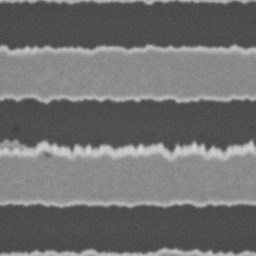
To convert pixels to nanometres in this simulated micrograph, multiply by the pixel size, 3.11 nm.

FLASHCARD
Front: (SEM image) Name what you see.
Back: lines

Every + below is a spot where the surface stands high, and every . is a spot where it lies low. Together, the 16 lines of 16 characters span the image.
................
................
................
++++++++++++++++
++++++++++++++++
++++++++++++++++
................
................
................
++++++++++.++.++
++++++++++++++++
++++++++++++++++
++++++++++++++++
................
................
................